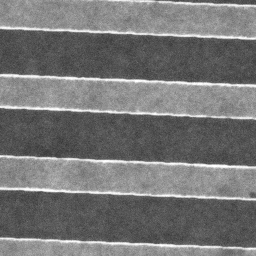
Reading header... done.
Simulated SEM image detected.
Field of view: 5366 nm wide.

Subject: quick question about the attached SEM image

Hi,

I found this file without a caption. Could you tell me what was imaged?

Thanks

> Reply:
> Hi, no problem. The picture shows lines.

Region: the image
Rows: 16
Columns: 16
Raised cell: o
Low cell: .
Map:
oooooooooooooooo
oooooooooooooooo
................
................
................
oooooooooooooooo
oooooooooooooooo
................
................
................
oooooooooooooooo
oooooooooooooooo
................
................
................
ooooooooooooooo.